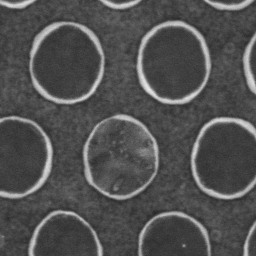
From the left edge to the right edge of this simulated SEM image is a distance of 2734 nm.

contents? raised bodies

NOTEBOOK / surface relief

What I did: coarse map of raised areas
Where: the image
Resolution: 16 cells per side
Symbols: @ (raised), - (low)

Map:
----------------
----------@@----
--@@@@---@@@@---
--@@@@---@@@@--@
--@@@@---@@@@---
--@@@@---@@@@---
----------------
@@-----@-----@@-
@@@---@@@---@@@@
@@@--@@@@@--@@@@
@@@--@@@@@--@@@@
@@@---@@@----@@@
----------------
---@@-----@@----
--@@@@---@@@@---
--@@@@---@@@@--@